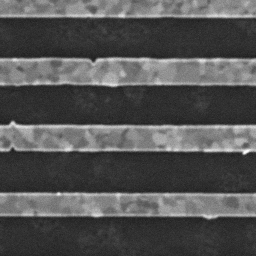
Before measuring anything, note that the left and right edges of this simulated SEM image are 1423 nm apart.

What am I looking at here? one or a few lines or trenches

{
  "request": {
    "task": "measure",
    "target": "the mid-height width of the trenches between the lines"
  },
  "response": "240 nm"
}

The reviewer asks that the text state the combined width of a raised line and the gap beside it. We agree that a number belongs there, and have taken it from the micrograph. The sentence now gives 0.369 um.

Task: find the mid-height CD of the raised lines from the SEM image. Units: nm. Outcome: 132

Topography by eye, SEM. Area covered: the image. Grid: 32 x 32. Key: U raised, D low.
UUUUUUUUUUUUUUUUUUUUUUUUUUUUUUUU
UUUUUUUUUUUUUUUUUUUUUUUUUUUUUUUU
DDDDDDDDDDDDDDDDDDDDDDDDDDDDDDDD
DDDDDDDDDDDDDDDDDDDDDDDDDDDDDDDD
DDDDDDDDDDDDDDDDDDDDDDDDDDDDDDDD
DDDDDDDDDDDDDDDDDDDDDDDDDDDDDDDD
DDDDDDDDDDDDDDDDDDDDDDDDDDDDDDDD
UUUUUUUUUUUDUUUUUUUUDDDDUDUUUUUU
UUUUUUUUUUUUUUUUUUUUUUUUUUUUUUUU
UUUUUUUUUUUUUUUUUUUUUUUUUUUUUUUU
UUUDDDDDDDDDUUUUDDDDDDDDUUDDDDDD
DDDDDDDDDDDDDDDDDDDDDDDDDDDDDDDD
DDDDDDDDDDDDDDDDDDDDDDDDDDDDDDDD
DDDDDDDDDDDDDDDDDDDDDDDDDDDDDDDD
DDDDDDDDDDDDDDDDDDDDDDDDDDDDDDDD
DDDDDDDDDDDDDDDDDDDDDDDDDDDDDDDD
UUUUUUUUUUUUUUUUUUUUUUUUUUUUUUUU
UUUUUUUUUUUUUUUUUUUUUUUUUUUUUUUU
UUUUUUUUUUUUUUUUUUUUUUUUUUUUUUUU
DDDDDDDDDDDDDDDDDDDDDDDDDDDDDDDD
DDDDDDDDDDDDDDDDDDDDDDDDDDDDDDDD
DDDDDDDDDDDDDDDDDDDDDDDDDDDDDDDD
DDDDDDDDDDDDDDDDDDDDDDDDDDDDDDDD
DDDDDDDDDDDDDDDDDDDDDDDDDDDDDDDD
UUUUUUUUUUUUUUUUUUUUUUUUUUUUUUUU
UUUUUUUUUUUUUUUUUUUUUUUUUUUUUUUU
UUUUUUUUUUUUUUUUUUUUUUUUUUUUUUUU
DDDDDDDDDDDDDDDDDDDDDDDDDDDDDDDD
DDDDDDDDDDDDDDDDDDDDDDDDDDDDDDDD
DDDDDDDDDDDDDDDDDDDDDDDDDDDDDDDD
DDDDDDDDDDDDDDDDDDDDDDDDDDDDDDDD
DDDDDDDDDDDDDDDDDDDDDDDDDDDDDDDD